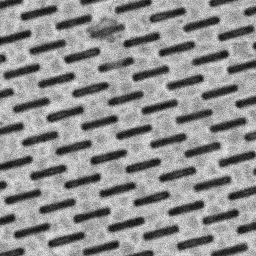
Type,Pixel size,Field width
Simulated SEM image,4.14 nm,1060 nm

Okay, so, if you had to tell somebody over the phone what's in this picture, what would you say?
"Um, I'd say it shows a regular array of holes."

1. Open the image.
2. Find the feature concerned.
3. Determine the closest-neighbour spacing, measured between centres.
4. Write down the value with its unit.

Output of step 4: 0.143 µm